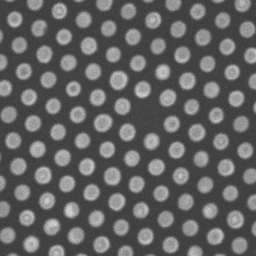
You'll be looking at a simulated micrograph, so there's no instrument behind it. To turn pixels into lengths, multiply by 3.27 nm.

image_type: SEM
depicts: a regular array of raised bodies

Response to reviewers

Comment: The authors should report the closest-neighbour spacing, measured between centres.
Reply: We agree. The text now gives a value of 0.0847 microns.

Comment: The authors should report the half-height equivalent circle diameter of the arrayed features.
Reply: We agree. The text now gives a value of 50.9 nm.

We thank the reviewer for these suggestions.